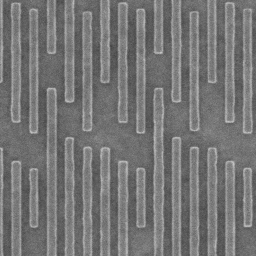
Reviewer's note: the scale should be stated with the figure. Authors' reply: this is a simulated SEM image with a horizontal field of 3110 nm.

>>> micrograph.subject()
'wiring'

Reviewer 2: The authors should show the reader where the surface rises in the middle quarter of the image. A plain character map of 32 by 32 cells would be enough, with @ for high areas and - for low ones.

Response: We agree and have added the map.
@@---@@--@@---@@--@@-------@@---
@@---@@--@@---@@--@@-------@@---
@@---@@--@@---@@--@@-------@@---
@@---@@--@@---@@--@@-------@@---
@@---@@---@---@@--@@-------@@---
@@---@@-------@@--@@-------@@---
@@---@@-------@@--@@---@@--@@---
@@---@@-------@@--@@---@@--@@---
@@---@@-------@@--@@---@@--@@---
-----@@-------@@--@@---@@-------
-----@@-------@@--@@---@@-------
-----@@-------@@--@@---@@-------
-----@@-------@@--@@---@@-------
-----@@-------@@--@@---@@-------
-----@@-----------@@---@@-------
-----@@-----------@@---@@-------
-----@@-----------@@---@@-------
-----------------------@@-------
-----------------------@@---@---
@@---------------------@@--@@---
@@---------------------@@--@@---
@@---@@--@@------------@@--@@---
@@---@@--@@------------@@--@@---
@@---@@--@@------------@@--@@---
@@---@@--@@---@@-------@@--@@---
@@---@@--@@---@@-------@@--@@---
@@---@@--@@---@@--@@---@@--@@---
@@---@@--@@---@@--@@---@@--@@---
@@---@@--@@---@@--@@---@@--@@---
@@---@@--@@---@@--@@---@@--@@---
@@---@@---@---@@--@@---@@--@@---
@@---@@--@@---@@--@@---@@--@@---